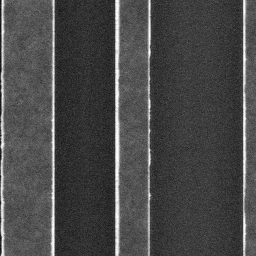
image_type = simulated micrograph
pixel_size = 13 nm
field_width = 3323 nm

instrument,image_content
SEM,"lines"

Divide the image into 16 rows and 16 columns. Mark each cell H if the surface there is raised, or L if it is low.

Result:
HHHLLLLHHLLLLLLH
HHHLLLLHHLLLLLLH
HHHLLLLHHLLLLLLH
HHHLLLLHHLLLLLLH
HHHLLLLHHLLLLLLH
HHHLLLLHHLLLLLLH
HHHLLLLHHLLLLLLH
HHHLLLLHHLLLLLLH
HHHLLLLHHLLLLLLH
HHHLLLLHHLLLLLLH
HHHLLLLHHLLLLLLH
HHHLLLLHHLLLLLLH
HHHLLLLHHLLLLLLH
HHHLLLLHHLLLLLLH
HHHLLLLHHLLLLLLH
HHHLLLLHHLLLLLLH